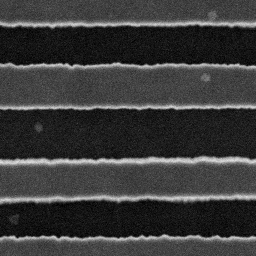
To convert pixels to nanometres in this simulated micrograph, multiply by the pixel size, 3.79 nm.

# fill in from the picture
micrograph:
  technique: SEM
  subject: lines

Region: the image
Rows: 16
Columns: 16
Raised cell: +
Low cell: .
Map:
++++++++++++++++
++++++++++++++++
................
................
++++++++++++++++
++++++++++++++++
++++++++++++++++
................
................
................
++++++++++++++++
++++++++++++++++
+...............
................
................
++++++++++++++++